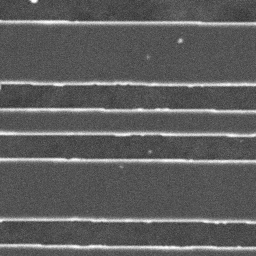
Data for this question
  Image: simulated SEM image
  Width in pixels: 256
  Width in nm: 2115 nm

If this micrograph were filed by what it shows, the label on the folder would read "lines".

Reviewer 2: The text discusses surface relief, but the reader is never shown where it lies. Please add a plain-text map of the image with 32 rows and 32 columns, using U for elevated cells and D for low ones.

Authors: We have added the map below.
DDDDDDDDDDDDDDDDDDDDDDDDDDDDDDDD
DDDDDDDDDDDDDDDDDDDDDDDDDDDDDDDD
DDDDDDDDDDDDDDDDDDDDDDDDDDDDDDDD
UUUUUUUUUUUUUUUUUUUUUUUUUUUUUUUU
UUUUUUUUUUUUUUUUUUUUUUUUUUUUUUUU
UUUUUUUUUUUUUUUUUUUUUUUUUUUUUUUU
UUUUUUUUUUUUUUUUUUUUUUUUUUUUUUUU
UUUUUUUUUUUUUUUUUUUUUUUUUUUUUUUU
UUUUUUUUUUUUUUUUUUUUUUUUUUUUUUUU
UUUUUUUUUUUUUUUUUUUUUUUUUUUUUUUU
DDDDUUUUUUUUUUUUUUUUUUUUUUUUUUUU
DDDDDDDDDDDDDDDDDDDDDDDDDDDDDDDD
DDDDDDDDDDDDDDDDDDDDDDDDDDDDDDDD
DDDDDDDDDDDDDDDDDDDDDDDDDDDDDDDD
UUUUUUUUUUUUUUUUUUUUUUUUUUUUUUUU
UUUUUUUUUUUUUUUUUUUUUUUUUUUUUUUU
UUUUUUUUUUUUUUUUUUUUUUUUUUUUUUUU
DDDDDDDDDDDDDDDDDDDDDDDDDDDDDDDD
DDDDDDDDDDDDDDDDDDDDDDDDDDDDDDDD
DDDDDDDDDDDDDDDDDDDDDDDDDDDDDDDD
UUUUUUUUUUUUUUUUUUUUUUUUUUUUUUUU
UUUUUUUUUUUUUUUUUUUUUUUUUUUUUUUU
UUUUUUUUUUUUUUUUUUUUUUUUUUUUUUUU
UUUUUUUUUUUUUUUUUUUUUUUUUUUUUUUU
UUUUUUUUUUUUUUUUUUUUUUUUUUUUUUUU
UUUUUUUUUUUUUUUUUUUUUUUUUUUUUUUU
UUUUUUUUUUUUUUUUUUUUUUUUUUUUUUUU
UUUUUUUUUUUUUUUUUUUUUUUUUUUUUUUU
DDDDDDDDDDDDDDDDDDDDDDDDDDDDDDDD
DDDDDDDDDDDDDDDDDDDDDDDDDDDDDDDD
DDDDDDDDDDDDDDDDDDDDDDDDDDDDDDDD
UUUUUUUUUUUUUUUUUUUUUUUUUUUUUUUU